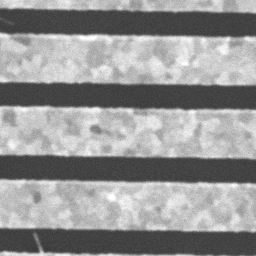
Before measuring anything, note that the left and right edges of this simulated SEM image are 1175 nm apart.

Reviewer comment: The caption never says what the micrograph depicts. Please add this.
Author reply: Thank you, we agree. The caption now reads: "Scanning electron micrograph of lines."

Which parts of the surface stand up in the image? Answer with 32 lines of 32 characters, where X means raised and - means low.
XXXXXXXXXXXXXXXXXXXXXXXXXXXXXXXX
------------------------------XX
--------------------------------
--------------------------------
XXXXXXXXXXXXXXXXXXXX------------
XXXXXXXXXXXXXXXXXXXXXXXXXXXXXXXX
XXXXXXXXXXXXXXXXXXXXXXXXXXXXXXXX
XXXXXXXXXXXXXXXXXXXXXXXXXXXXXXXX
XXXXXXXXXXXXXXXXXXXXXXXXXXXXXXXX
XXXXXXXXXXXXXXXXXXXXXXXXXXXXXXXX
-----------------------X-XXXXXXX
--------------------------------
--------------------------------
XXXXXXXXXXXXXX-X----------------
XXXXXXXXXXXXXXXXXXXXXXXXXXXXXXXX
XXXXXXXXXXXXXXXXXXXXXXXXXXXXXXXX
XXXXXXXXXXXXXXXXXXXXXXXXXXXXXXXX
XXXXXXXXXXXXXXXXXXXXXXXXXXXXXXXX
XXXXXXXXXXXXXXXXXXXXXXXXXXXXXXXX
---------------XXXXXXXXXXXXXXXXX
--------------------------------
--------------------------------
X-X-----------------------------
XXXXXXXXXXXXXXXXXXXXXXXXXXXXXXXX
XXXXXXXXXXXXXXXXXXXXXXXXXXXXXXXX
XXXXXXXXXXXXXXXXXXXXXXXXXXXXXXXX
XXXXXXXXXXXXXXXXXXXXXXXXXXXXXXXX
XXXXXXXXXXXXXXXXXXXXXXXXXXXXXXXX
------X-XXXXXXXXXXXXXXXXXXXXXXXX
--------------------------------
--------------------------------
X----X--------------------------